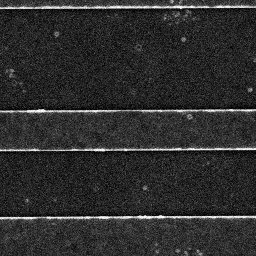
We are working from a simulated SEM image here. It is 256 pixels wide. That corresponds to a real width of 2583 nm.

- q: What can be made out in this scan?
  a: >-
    one or a few lines or trenches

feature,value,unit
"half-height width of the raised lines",407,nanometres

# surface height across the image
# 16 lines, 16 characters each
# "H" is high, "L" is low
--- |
HHHHHHHHHLHHLLLL
LLLLLLLLLLLLLLLL
LLLLLLLLLLLLLLLL
LLLLLLLLLLLLLLLL
LLLLLLLLLLLLLLLL
LLLLLLLLLLLLLLLL
LLLLLLLLLLLLLLLL
HHHHHHHHHHHHHHHH
HHHHHHHHHHHHHHHH
LLLLLLLLLLLLLLLL
LLLLLLLLLLLLLLLL
LLLLLLLLLLLLLLLL
LLLLLLLLLLLLLLLL
LLLLLLLLLLLLLLLL
HHHHHHHHHHHHHHHH
HHHHHHHHHHHHHHHH